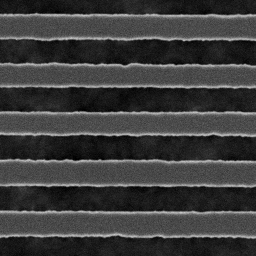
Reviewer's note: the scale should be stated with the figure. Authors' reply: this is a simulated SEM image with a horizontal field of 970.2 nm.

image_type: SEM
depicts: lines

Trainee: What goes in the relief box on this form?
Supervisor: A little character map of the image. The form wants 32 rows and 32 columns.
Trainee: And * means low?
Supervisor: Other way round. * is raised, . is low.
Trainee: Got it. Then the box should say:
................................
................................
********************************
********************************
********************************
................................
................................
................................
********************************
********************************
********************************
................................
................................
................................
********************************
********************************
********************************
................................
................................
................................
********************************
********************************
********************************
................................
................................
................................
********************************
********************************
********************************
**************.*****************
................................
................................